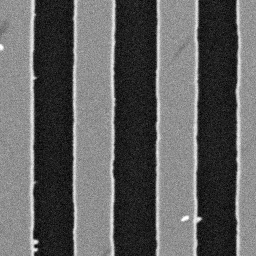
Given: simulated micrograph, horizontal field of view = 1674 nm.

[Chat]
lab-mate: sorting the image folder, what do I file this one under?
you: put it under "lines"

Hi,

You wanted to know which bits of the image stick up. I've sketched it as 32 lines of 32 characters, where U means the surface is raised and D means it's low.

UUUUDDDDDUUUUUDDDDDDUUUUUDDDDDUU
UUUUDDDDDUUUUUDDDDDDUUUUUDDDDDUU
UUUUDDDDDUUUUUDDDDDDUUUUUDDDDDUU
UUUUDDDDDUUUUUDDDDDDUUUUUDDDDDUU
UUUUDDDDDUUUUUDDDDDDUUUUUDDDDDUU
UUUUDDDDDUUUUUDDDDDDUUUUUDDDDDUU
UUUUDDDDDUUUUUDDDDDDUUUUUDDDDDUU
UUUUDDDDDUUUUUDDDDDDUUUUUDDDDDUU
UUUUDDDDDUUUUUDDDDDDUUUUUDDDDDUU
UUUUDDDDDUUUUUDDDDDDUUUUUDDDDDUU
UUUUDDDDDUUUUUDDDDDDUUUUUDDDDDUU
UUUUDDDDDUUUUUDDDDDDUUUUUDDDDDUU
UUUUDDDDDUUUUUDDDDDDUUUUUDDDDDUU
UUUUDDDDDUUUUUDDDDDDUUUUUDDDDDUU
UUUUDDDDDUUUUUDDDDDDUUUUUDDDDDUU
UUUUDDDDDUUUUUDDDDDDUUUUUDDDDDUU
UUUUDDDDDUUUUUDDDDDDUUUUDDDDDDUU
UUUUDDDDDUUUUUDDDDDDUUUUDDDDDDUU
UUUUDDDDDUUUUUDDDDDDUUUUUDDDDDUU
UUUUDDDDDUUUUUDDDDDDUUUUUDDDDDUU
UUUUDDDDDUUUUUDDDDDDUUUUUDDDDDUU
UUUUDDDDDUUUUUDDDDDDUUUUDDDDDDUU
UUUUDDDDDUUUUUDDDDDDUUUUDDDDDDUU
UUUUDDDDDUUUUUDDDDDDUUUUDDDDDDUU
UUUUDDDDDUUUUUDDDDDDUUUUDDDDDDUU
UUUUDDDDDUUUUUDDDDDDUUUUUDDDDDUU
UUUUDDDDDUUUUUDDDDDDUUUUUDDDDDUU
UUUUDDDDDUUUUUDDDDDDUUUUUDDDDDUU
UUUUDDDDDUUUUUDDDDDDUUUUDDDDDDUU
UUUUDDDDDUUUUUDDDDDDUUUUDDDDDDUU
UUUUDDDDDUUUUUDDDDDDUUUUUDDDDDUU
UUUUDDDDDUUUUUDDDDDDUUUUDDDDDDUU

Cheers